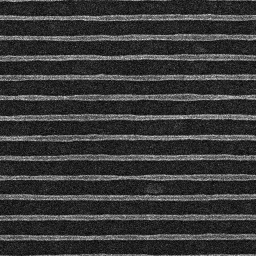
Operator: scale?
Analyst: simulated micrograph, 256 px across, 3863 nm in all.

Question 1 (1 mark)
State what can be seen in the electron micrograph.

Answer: parallel lines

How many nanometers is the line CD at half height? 64.1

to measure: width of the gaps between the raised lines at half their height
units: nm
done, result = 234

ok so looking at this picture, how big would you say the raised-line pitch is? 301 nanometres